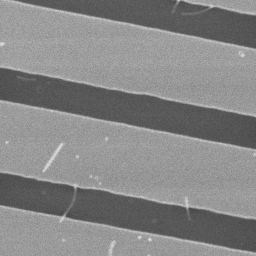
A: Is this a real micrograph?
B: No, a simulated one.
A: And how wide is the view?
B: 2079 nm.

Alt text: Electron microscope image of lines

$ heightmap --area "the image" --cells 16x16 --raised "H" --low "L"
HHHLLLLLLLLLLLHH
HHHHHHHHLLLLLLLL
HHHHHHHHHHHHHLLL
HHHHHHHHHHHHHHHH
LLHHHHHHHHHHHHHH
LLLLLLHHHHHHHHHH
HLLLLLLLLLLLHHHH
HHHHHHLLLLLLLLLL
HHHHHHHHHHHLLLLL
HHHHHHHHHHHHHHHH
HHHHHHHHHHHHHHHH
LLLLHHHHHHHHHHHH
LLLLLLLLLHHHHHHH
HHHHLLLLLLLLLLLH
HHHHHHHHHLLLLLLL
HHHHHHHHHHHHHHLL